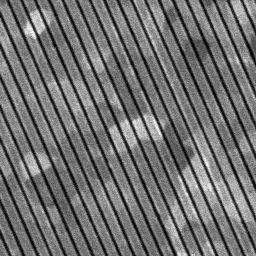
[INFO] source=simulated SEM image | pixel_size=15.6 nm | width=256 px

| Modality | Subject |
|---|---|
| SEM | parallel lines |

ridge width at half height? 137 nm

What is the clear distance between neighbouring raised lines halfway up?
0.0553 micrometres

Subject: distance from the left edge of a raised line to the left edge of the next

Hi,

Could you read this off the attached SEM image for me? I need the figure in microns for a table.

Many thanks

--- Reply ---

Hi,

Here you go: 0.196